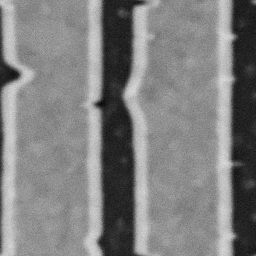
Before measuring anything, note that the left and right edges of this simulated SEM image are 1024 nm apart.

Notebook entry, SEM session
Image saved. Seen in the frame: one or a few lines or trenches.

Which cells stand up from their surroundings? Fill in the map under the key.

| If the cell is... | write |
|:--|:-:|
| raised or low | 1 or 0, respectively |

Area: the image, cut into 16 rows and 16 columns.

1111110001111100
1111110001111100
1111110001111100
0111110001111100
0111110001111100
0111110011111100
1111110011111100
0111110001111100
0111110001111100
1111110001111100
1111110001111100
1111110001111100
1111110001111100
1111110001111100
1111110001111100
1111110001111100